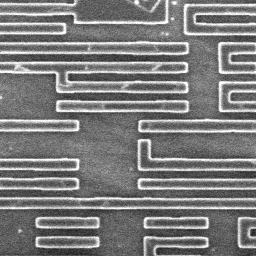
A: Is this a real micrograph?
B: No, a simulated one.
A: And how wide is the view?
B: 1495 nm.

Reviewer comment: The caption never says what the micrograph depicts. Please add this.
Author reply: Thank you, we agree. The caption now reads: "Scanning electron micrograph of wiring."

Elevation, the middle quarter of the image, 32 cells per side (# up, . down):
###############################.
###############################.
#...............................
#...............................
##...............###............
###############################.
###############################.
................................
................................
####...................########.
###############################.
###############################.
................................
................................
###................#############
###................#############
###................#############
................................
................................
...................##...........
...................##...........
...................##...........
...................##...........
...................###..........
###................#############
###................#############
................................
................................
................................
###................#############
###................#############
................................